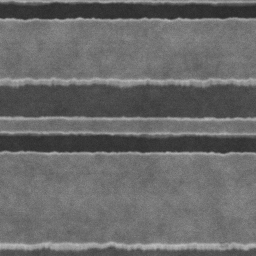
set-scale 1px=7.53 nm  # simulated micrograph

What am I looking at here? lines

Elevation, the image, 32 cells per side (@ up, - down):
--------------------------------
--------------------------------
@@@@@@@@@@@@@@@@@@@@@@@@@@@@@@@@
@@@@@@@@@@@@@@@@@@@@@@@@@@@@@@@@
@@@@@@@@@@@@@@@@@@@@@@@@@@@@@@@@
@@@@@@@@@@@@@@@@@@@@@@@@@@@@@@@@
@@@@@@@@@@@@@@@@@@@@@@@@@@@@@@@@
@@@@@@@@@@@@@@@@@@@@@@@@@@@@@@@@
@@@@@@@@@@@@@@@@@@@@@@@@@@@@@@@@
@@@@@@@@@@@@@@@@@@@@@@@@@@@@@@@@
--------------------------------
--------------------------------
--------------------------------
--------------------------------
--------------------------------
@@@@@@@@@@@@@@@@@@@@@@@@@@@@@@@@
@@@@@@@@@@@@@@@@@@@@@@@@@@@@@@@@
--------------------------------
--------------------------------
@@@@@@@@@@@@@@@@@@@@@@@@@@@@@@@@
@@@@@@@@@@@@@@@@@@@@@@@@@@@@@@@@
@@@@@@@@@@@@@@@@@@@@@@@@@@@@@@@@
@@@@@@@@@@@@@@@@@@@@@@@@@@@@@@@@
@@@@@@@@@@@@@@@@@@@@@@@@@@@@@@@@
@@@@@@@@@@@@@@@@@@@@@@@@@@@@@@@@
@@@@@@@@@@@@@@@@@@@@@@@@@@@@@@@@
@@@@@@@@@@@@@@@@@@@@@@@@@@@@@@@@
@@@@@@@@@@@@@@@@@@@@@@@@@@@@@@@@
@@@@@@@@@@@@@@@@@@@@@@@@@@@@@@@@
@@@@@@@@@@@@@@@@@@@@@@@@@@@@@@@@
@@@@@@@@@@@@@@@@@@@@@@@@@@@@@@@@
--------------------------------